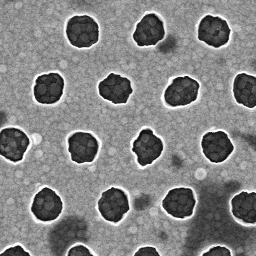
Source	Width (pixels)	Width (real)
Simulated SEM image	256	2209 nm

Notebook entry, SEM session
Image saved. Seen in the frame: a regular array of holes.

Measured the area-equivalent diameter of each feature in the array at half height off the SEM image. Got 0.275 µm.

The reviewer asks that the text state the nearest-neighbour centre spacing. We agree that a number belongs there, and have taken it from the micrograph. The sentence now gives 561 nm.